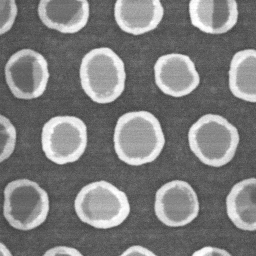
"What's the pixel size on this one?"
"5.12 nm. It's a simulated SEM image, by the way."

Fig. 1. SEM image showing a regular array of raised bodies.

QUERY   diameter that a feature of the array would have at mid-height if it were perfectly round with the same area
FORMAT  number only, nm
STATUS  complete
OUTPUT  228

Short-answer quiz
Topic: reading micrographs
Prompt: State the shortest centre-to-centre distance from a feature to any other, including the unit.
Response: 376 nm